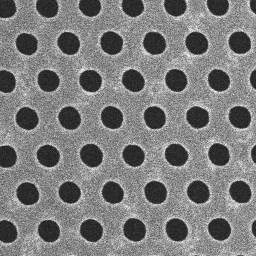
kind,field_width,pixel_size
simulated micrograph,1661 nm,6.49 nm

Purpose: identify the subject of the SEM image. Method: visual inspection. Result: a regular array of holes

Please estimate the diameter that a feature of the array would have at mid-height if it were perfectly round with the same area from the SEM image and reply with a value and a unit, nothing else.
146 nm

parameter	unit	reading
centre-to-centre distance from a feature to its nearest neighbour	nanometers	275